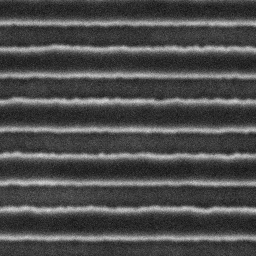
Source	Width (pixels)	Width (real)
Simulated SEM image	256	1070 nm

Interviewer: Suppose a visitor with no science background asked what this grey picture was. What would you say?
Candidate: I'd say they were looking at lines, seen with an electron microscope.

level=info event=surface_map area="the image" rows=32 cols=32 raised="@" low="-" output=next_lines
@@@@@@@@@@@@@@@@@@@@@@@@@@@@@@@@
@@@@@@@@@@@@@@@@@@@@@@@@@@@@@@@@
@@@@@@@@@@@@@@@@@@@@@@@@@@@@@@@@
--------------------------------
--------------------------------
--------------------------------
@@@@@@@@@@@@@@@@@@@@@@@@@@@@@@@@
@@@@@@@@@@@@@@@@@@@@@@@@@@@@@@@@
@@@@@@@@@@@@@@@@@@@@@@@@@@@@@@@@
@@@@@@@@@@@@@@@@@@@@@@@@@@@@@@@@
--------------------------------
--------------------------------
-@@@@@@@@@@@@@@@@@@--@@@-@@@-@--
@@@@@@@@@@@@@@@@@@@@@@@@@@@@@@@@
@@@@@@@@@@@@@@@@@@@@@@@@@@@@@@@@
@@@@@@@@@@@@@@@@@@@@@@@@@@@@@@@@
--------------------@@----@@--@-
--------------------------------
--------------------------------
@@@@@@@@@@@@@@@@@@@@@@@@@@@@@@@@
@@@@@@@@@@@@@@@@@@@@@@@@@@@@@@@@
@@@@@@@@@@@@@@@@@@@@@@@@@@@@@@@@
@@@@@@@@@@@@@@@@@@@@@@@@@@@@@@@@
--------------------------------
--------------------------------
--------------------------------
@@@@@@@@@@@@@@@@@@@@@@@@@@@@@@@@
@@@@@@@@@@@@@@@@@@@@@@@@@@@@@@@@
@@@@@@@@@@@@@@@@@@@@@@@@@@@@@@@@
@@@@@@@@@@@@@@@@@@@@@@@@@@@@@@@@
--------------------------------
--------------------------------